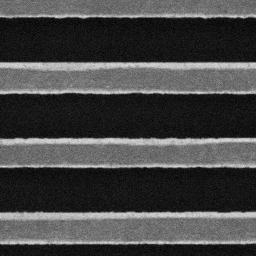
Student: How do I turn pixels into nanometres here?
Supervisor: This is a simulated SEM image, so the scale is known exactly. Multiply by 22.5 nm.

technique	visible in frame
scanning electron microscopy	lines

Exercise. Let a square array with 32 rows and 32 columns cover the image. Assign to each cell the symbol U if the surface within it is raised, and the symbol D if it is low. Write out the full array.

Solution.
UUUUUUUUUUUUUUUUUUUUUUUUUUUUUUUU
UUUUUUUUUUUUUUUUUUUUUUUUUUUUUUUU
DDDDDDDDDDDDDDDDDDDDDDDDDDDDDDDD
DDDDDDDDDDDDDDDDDDDDDDDDDDDDDDDD
DDDDDDDDDDDDDDDDDDDDDDDDDDDDDDDD
DDDDDDDDDDDDDDDDDDDDDDDDDDDDDDDD
DDDDDDDDDDDDDDDDDDDDDDDDDDDDDDDD
DDDDDDDDDDDDDDDDDDDDDDDDDDDDDDDD
UUUUUUUUUUUUUUUUUUUUUUUUUUUUUUUU
UUUUUUUUUUUUUUUUUUUUUUUUUUUUUUUU
UUUUUUUUUUUUUUUUUUUUUUUUUUUUUUUU
UUUUUUUUUUUUUUUUUUUUUUUUUUUUUUUU
DDDDDDDDDDDDDDDDDDDDDDDDDDDDDDDD
DDDDDDDDDDDDDDDDDDDDDDDDDDDDDDDD
DDDDDDDDDDDDDDDDDDDDDDDDDDDDDDDD
DDDDDDDDDDDDDDDDDDDDDDDDDDDDDDDD
DDDDDDDDDDDDDDDDDDDDDDDDDDDDDDDD
DDDDDDDDDDDDDDDDDDDDDDDDDDDDDDDD
UUUUUUUUUUUUUUUUUUUUUUUUUUUUUUUU
UUUUUUUUUUUUUUUUUUUUUUUUUUUUUUUU
UUUUUUUUUUUUUUUUUUUUUUUUUUUUUUUU
DDDDDDDDDDDDDDDDDDDDDDDDDDDDDDDD
DDDDDDDDDDDDDDDDDDDDDDDDDDDDDDDD
DDDDDDDDDDDDDDDDDDDDDDDDDDDDDDDD
DDDDDDDDDDDDDDDDDDDDDDDDDDDDDDDD
DDDDDDDDDDDDDDDDDDDDDDDDDDDDDDDD
DDDDDDDDDDDDDDDDDDDDDDDDDDDDDDDD
UUUUUUUUUUUUUUUUUUUUUUUUUUUUUUUU
UUUUUUUUUUUUUUUUUUUUUUUUUUUUUUUU
UUUUUUUUUUUUUUUUUUUUUUUUUUUUUUUU
DDDDDDDDDDDDDDDDDDDDDDDDDDDDDDDD
DDDDDDDDDDDDDDDDDDDDDDDDDDDDDDDD